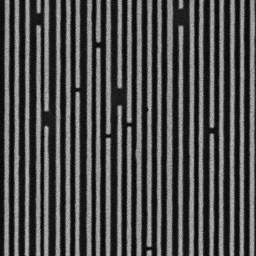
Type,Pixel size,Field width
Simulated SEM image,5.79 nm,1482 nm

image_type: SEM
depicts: parallel lines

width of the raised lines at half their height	29.6	nm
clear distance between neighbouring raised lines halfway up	0.0296	micrometres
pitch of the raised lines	59.2	nm